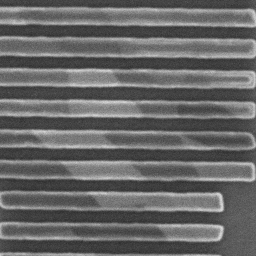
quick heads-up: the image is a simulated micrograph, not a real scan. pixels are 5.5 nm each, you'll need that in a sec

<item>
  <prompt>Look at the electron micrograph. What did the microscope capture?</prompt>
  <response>wiring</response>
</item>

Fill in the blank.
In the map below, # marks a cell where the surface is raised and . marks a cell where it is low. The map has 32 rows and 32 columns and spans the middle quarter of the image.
................................
.....###........................
################################
################################
################################
....##..##........##############
................................
................................
................................
###############################.
################################
################################
################################
................................
................................
................................
................................
################################
################################
################################
################################
................................
................................
................................
###########..####...............
################################
################################
################################
..##############################
................................
................................
................................